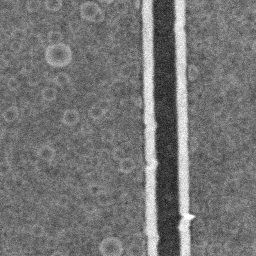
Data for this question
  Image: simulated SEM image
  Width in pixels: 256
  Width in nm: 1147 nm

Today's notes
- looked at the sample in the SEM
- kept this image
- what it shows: one or a few lines or trenches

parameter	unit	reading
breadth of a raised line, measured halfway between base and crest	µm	0.149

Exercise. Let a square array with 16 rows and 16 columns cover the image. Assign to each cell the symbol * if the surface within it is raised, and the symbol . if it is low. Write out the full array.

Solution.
.........**.....
.........**.....
.........**.....
.........**.....
.........**.....
.........**.....
.........**.....
.........**.....
.........**.....
.........**.....
.........**.....
.........***....
.........***....
.........***....
.........***....
..........**....